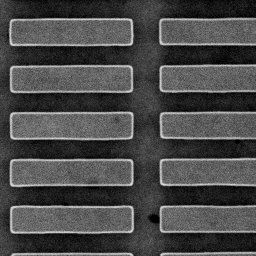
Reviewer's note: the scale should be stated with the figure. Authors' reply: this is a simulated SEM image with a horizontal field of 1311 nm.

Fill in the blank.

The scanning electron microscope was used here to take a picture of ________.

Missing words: groups of lines, slits or small figures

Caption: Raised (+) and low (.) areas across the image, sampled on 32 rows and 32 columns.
................................
................................
..++++++++++++++....++++++++++++
.+++++++++++++++....++++++++++++
.+++++++++++++++....++++++++++++
..++++++++++++++....++++++++++++
................................
................................
..++++++++++++++....++++++++++++
.+++++++++++++++....++++++++++++
.+++++++++++++++....++++++++++++
................................
................................
................................
.++++++++++++++++...++++++++++++
.++++++++++++++++...++++++++++++
.++++++++++++++++...++++++++++++
................................
................................
................................
.++++++++++++++++...++++++++++++
.++++++++++++++++...++++++++++++
.++++++++++++++++...++++++++++++
................................
................................
................................
.++++++++++++++++...++++++++++++
.++++++++++++++++...++++++++++++
.++++++++++++++++...++++++++++++
................................
................................
................................